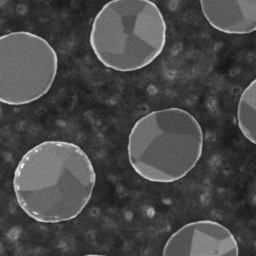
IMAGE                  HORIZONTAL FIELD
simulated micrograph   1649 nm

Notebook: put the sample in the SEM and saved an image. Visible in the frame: raised bodies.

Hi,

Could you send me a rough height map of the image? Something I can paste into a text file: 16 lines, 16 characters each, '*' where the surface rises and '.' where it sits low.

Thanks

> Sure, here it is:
.......***...***
......****...***
***...****......
***...****......
***.............
***............*
...............*
.........***...*
........*****..*
..***...*****...
.*****..****....
.*****..........
.*****..........
..***...........
...........***..
..........*****.